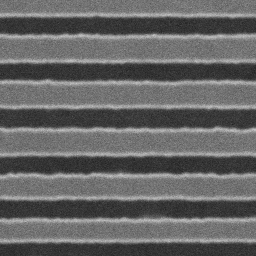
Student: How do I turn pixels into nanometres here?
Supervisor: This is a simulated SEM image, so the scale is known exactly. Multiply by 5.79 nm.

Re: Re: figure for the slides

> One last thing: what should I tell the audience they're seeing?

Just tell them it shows lines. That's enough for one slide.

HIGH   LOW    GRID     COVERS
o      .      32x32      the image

oooooooooooooooooooooooooooooooo
oooooooooooooooooooooooooooooooo
................................
................................
oooooooooooooo..oooooooooo.ooooo
oooooooooooooooooooooooooooooooo
oooooooooooooooooooooooooooooooo
oooooooooooooooooooooooooooooooo
................................
................................
oooooooooooooooooooooooooooooooo
oooooooooooooooooooooooooooooooo
oooooooooooooooooooooooooooooooo
.oo......o.................oo...
................................
................................
oooooooooooooooooooooooooooooooo
oooooooooooooooooooooooooooooooo
oooooooooooooooooooooooooooooooo
..............oo...............o
................................
................................
oooooooooooooooooooooooooooooooo
oooooooooooooooooooooooooooooooo
oooooooooooooooooooooooooooooooo
................................
................................
oooooooooooooooooooooooooooooooo
oooooooooooooooooooooooooooooooo
oooooooooooooooooooooooooooooooo
................................
................................